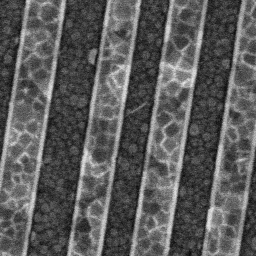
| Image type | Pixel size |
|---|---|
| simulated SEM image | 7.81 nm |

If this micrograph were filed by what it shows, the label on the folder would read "one or a few lines or trenches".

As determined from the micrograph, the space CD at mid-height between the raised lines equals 291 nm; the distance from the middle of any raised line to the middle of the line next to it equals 542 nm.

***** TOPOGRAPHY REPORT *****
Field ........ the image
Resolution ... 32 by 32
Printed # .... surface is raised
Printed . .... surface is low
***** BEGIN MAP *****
...#####......###....#####....##
...#####.....####....####.....##
...#####.....####....####.....##
...####......####....####.....##
...####......####....####.....##
...####......###.....####.....##
...####......###....#####....###
..#####.....####....#####....###
..#####.....####....####.....###
..#####.....####....####.....###
..####......####....####.....###
..####......####....####.....###
..####......###.....####....####
.#####.....####....#####....####
.#####.....####....####.....####
.#####.....####....####.....####
.####......####....####.....####
.####......####....####.....####
.####......###.....####.....####
#####......###....#####....#####
#####.....####....####.....####.
#####.....####....####.....####.
####......####....####.....####.
####......####....####.....####.
####......####....####.....####.
####......###.....####....#####.
####.....####....#####....####..
####.....####....####.....####..
####.....####....####.....####..
###......####....####.....####..
###......####....####.....####..
###......###.....####....#####..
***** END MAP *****